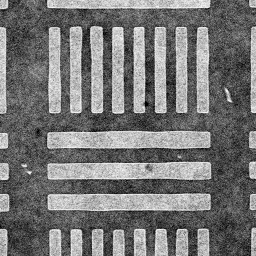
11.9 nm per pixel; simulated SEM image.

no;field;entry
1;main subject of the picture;groups of lines, slits or small figures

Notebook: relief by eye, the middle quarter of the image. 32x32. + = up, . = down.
..++...++...+++...++...++...+.+.
..++...++...+++...++...++...+++.
..++...++...+++...++...++...+++.
..++...++...+++...++...++...+++.
..++...++...+++...++...++...+++.
..++...++...+++...++...++...+++.
..++...++...+++...++...++...+++.
..++...++...+++...++...++...+++.
..++...++...+++...++...++...+++.
..++...++...+++...++...++...+++.
..++...++...+++...++...++...+++.
..++...++...+++...++...++...+++.
................................
................................
................................
................................
................................
++++++++++++++++++++++++++++++++
++++++++++++++++++++++++++++++++
++++++++++++++++++++++++++++++++
++++++++++++++++++++++++++++++++
................................
................................
................................
................................
++++++++++++++++++++++++++++++++
++++++++++++++++++++++++++++++++
++++++++++++++++++++++++++++++++
+++++++++++++++++++++.....++++++
................................
................................
................................